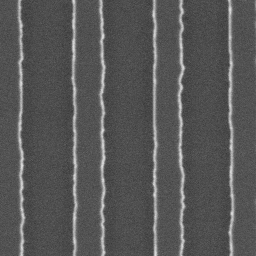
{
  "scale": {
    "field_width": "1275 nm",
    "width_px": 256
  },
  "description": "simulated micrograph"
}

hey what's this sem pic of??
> lines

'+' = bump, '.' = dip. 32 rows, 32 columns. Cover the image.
++.......++++......++++......+++
++.......++++......++++......+++
+++......++++......++++......+++
+++......++++......++++......+++
+++......++++......++++......+++
+++......++++......++++......+++
+++......++++......++++......+++
+++......++++......++++......+++
+++......++++......++++......+++
+++......++++......++++......+++
+++......++++......++++......+++
+++......++++......++++......+++
+++......++++......++++......+++
+++......++++......++++......+++
+++......++++......++++......+++
+++......++++......++++......+++
+++......++++......++++......+++
+++......++++......++++......+++
+++......++++......++++......+++
+++......++++......++++......+++
+++......++++......++++......+++
+++......++++......++++......+++
+++......++++......++++......+++
+++......++++......++++......+++
+++......++++......++++......+++
+++......++++......++++......+++
+++......++++......++++......+++
+++......++++......++++......+++
+++......++++......++++......+++
+++......++++......++++......+++
+++......++++......++++......+++
+++......++++......++++......+++